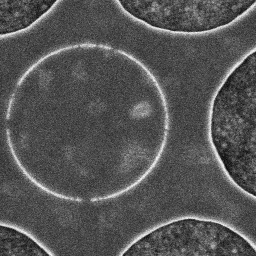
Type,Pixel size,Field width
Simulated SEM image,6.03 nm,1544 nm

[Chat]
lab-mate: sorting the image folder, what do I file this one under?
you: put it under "holes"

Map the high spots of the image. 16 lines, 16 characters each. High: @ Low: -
---@@@@@--------
--@@@@@@@-----@@
@@@@@@@@@@@@@@@@
@@@@@@@@@@@@@@@@
@@@@@@@@@@@@@@@-
@@@@@@@@@@@@@@--
@@@@@@@@@@@@@---
@@@@@@@@@@@@@---
@@@@@@@@@@@@@---
@@@@@@@@@@@@@@--
@@@@@@@@@@@@@@--
@@@@@@@@@@@@@@@-
@@@@@@@@@@@@@@@@
@@@@@@@@@@@@@@@@
-@@@@@@@@------@
---@@@@@--------